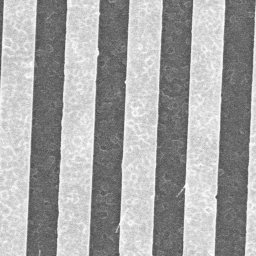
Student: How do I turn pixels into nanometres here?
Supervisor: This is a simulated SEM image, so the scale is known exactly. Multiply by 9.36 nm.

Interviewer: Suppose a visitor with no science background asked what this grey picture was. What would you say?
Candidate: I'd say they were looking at one or a few lines or trenches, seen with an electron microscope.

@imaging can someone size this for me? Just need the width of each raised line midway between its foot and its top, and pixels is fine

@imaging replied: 31.2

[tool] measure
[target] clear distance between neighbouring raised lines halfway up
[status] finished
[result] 291 nanometres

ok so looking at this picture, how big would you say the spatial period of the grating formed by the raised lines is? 0.589 µm